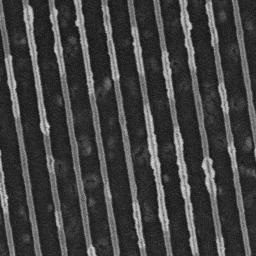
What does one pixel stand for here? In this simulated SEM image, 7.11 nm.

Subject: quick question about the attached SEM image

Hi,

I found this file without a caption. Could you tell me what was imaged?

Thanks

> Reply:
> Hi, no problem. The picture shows parallel lines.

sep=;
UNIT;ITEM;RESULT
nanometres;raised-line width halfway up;40.3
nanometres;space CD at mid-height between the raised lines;142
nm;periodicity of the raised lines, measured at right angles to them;184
